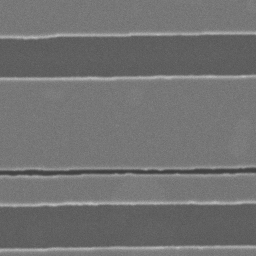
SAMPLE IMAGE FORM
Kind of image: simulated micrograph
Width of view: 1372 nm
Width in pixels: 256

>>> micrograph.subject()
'lines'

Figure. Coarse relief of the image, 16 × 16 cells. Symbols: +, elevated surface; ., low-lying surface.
++++++++++++++++
++++++++++++++++
................
................
................
++++++++++++++++
++++++++++++++++
++++++++++++++++
++++++++++++++++
++++++++++++++++
++++++++++++++++
++++++++++++++++
++++++++++++++++
................
................
.........+++++++